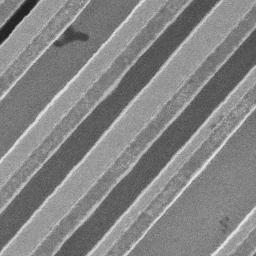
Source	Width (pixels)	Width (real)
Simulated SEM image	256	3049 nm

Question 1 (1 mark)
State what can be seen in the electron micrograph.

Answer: lines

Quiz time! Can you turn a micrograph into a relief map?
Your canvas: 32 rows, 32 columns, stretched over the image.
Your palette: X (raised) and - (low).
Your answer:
XXX--XXXXXX------XXXXXX----XXXXX
XX--XXXXXX-------XXXXX----XXXXXX
X--XXXXXX-------XXXXX-----XXXXXX
--XXXXXX-------XXXXXX----XXXXXXX
-XXXXXX-------XXXXXX----XXXXXXX-
XXXXXX-------XXXXXX----XXXXXXX--
XXXXX-------XXXXXX----XXXXXXX---
XXXX-------XXXXXX----XXXXXXX----
XXX--------XXXXX----XXXXXXX-----
XXX-------XXXXX----XXXXXXX-----X
XX-------XXXXX-----XXXXXXX----XX
X-------XXXXXX----XXXXXXX----XXX
-------XXXXXX----XXXXXXX----XXXX
------XXXXXX----XXXXXXX----XXXXX
-----XXXXXX----XXXXXXX----XXXXX-
----XXXXXX----XXXXXXX-----XXXX--
---XXXXXX----XXXXXXX-----XXXX---
--XXXXXX-----XXXXXX-----XXXX----
--XXXXX-----XXXXXX-----XXXX-----
-XXXXX-----XXXXXX-----XXXXX-----
XXXXX-----XXXXXXX----XXXXX------
XXXX-----XXXXXXX----XXXXX-------
XXX-----XXXXXXX----XXXXX--------
XXX----XXXXXXX----XXXXX---------
XX----XXXXXXX-----XXXX----------
X-----XXXXXX-----XXXX-----------
-----XXXXXX-----XXXX------------
----XXXXXXX----XXXX------------X
---XXXXXXX----XXXXX-----------XX
--XXXXXXX----XXXXX-----------XXX
-XXXXXXX----XXXXX-----------XXXX
XXXXXXX----XXXXX-----------XXXXX